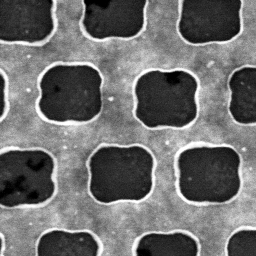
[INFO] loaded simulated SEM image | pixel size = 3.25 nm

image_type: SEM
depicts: holes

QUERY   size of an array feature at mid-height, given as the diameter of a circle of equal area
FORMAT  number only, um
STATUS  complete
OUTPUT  0.209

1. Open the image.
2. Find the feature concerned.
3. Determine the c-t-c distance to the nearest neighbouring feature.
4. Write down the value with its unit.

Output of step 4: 283 nanometers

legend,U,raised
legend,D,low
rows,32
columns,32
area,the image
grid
DDDDDDDUUUDDDDDDDDUUUUUDDDDDDDUU
DDDDDDDUUUUDDDDDDDUUUUUDDDDDDDUU
DDDDDDDUUUDDDDDDDDUUUUDDDDDDDDUU
DDDDDDDUUUDDDDDDDDUUUUDDDDDDDDUU
DDDDDDUUUUUDDDDDDUUUUUUDDDDDDUUU
UUUUUUUUUUUUUUUUUUUUUUUUUUUUUUUU
UUUUUUUUUUUUUUUUUUUUUUUUUUUUUUUU
UUUUUUUUUUUUUUUUUUUUUUUUUUUUUUUU
UUUUUUDDDDDDUUUUUUUUUUUUUUUUUUDD
UUUUUDDDDDDDDUUUUDDDDDDDUUUUUDDD
DUUUUDDDDDDDDUUUUDDDDDDDDUUUUDDD
DUUUUDDDDDDDDUUUUDDDDDDDUUUUUDDD
DUUUUDDDDDDDDUUUUDDDDDDDDUUUUDDD
DUUUUDDDDDDDDUUUUDDDDDDDDUUUUDDD
UUUUUDDDDDDDUUUUUDDDDDDDDUUUUDDD
UUUUUUUUUUUUUUUUUUDDDDDDUUUUUUUD
UUUUUUUUUUUUUUUUUUUUUUUUUUUUUUUU
UUUUUUUUUUUUUUUUUUUUUUUUUUUUUUUU
UUUUUUUUUUUUDDDDDDUUUUUUDDDDDUUU
DDDDDDUUUUUDDDDDDDDUUUDDDDDDDDUU
DDDDDDDUUUUDDDDDDDDUUUDDDDDDDDUU
DDDDDDDUUUUDDDDDDDDUUUDDDDDDDDUU
DDDDDDDUUUUDDDDDDDDUUUDDDDDDDDUU
DDDDDDDUUUUDDDDDDDDUUUDDDDDDDDUU
DDDDDDDUUUUUDDDDDDUUUUUDDDDDDUUU
DDDDDUUUUUUUUUUUUUUUUUUUUUUUUUUU
UUUUUUUUUUUUUUUUUUUUUUUUUUUUUUUU
UUUUUUUUUUUUUUUUUUUUUUUUUUUUUUUU
UUUUUUUUUUUUUUUUUUUUUUUUUUUUUUUU
UUUUUDDDDDDDUUUUUUDDDDDDUUUUUDDD
UUUUUDDDDDDDUUUUUDDDDDDDDUUUDDDD
UUUUUDDDDDDDUUUUUDDDDDDDDUUUDDDD